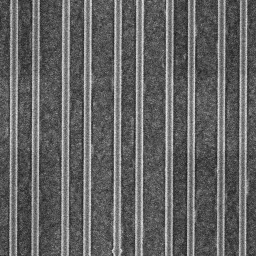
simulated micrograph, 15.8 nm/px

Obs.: parallel lines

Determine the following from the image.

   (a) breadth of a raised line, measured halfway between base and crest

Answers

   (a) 104 nm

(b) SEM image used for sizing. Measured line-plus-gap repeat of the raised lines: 0.402 um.